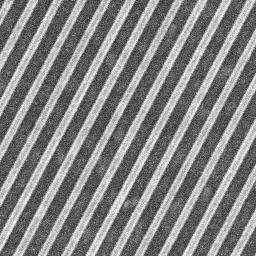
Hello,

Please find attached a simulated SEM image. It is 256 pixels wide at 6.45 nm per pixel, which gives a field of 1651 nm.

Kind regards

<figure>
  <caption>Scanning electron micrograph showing parallel lines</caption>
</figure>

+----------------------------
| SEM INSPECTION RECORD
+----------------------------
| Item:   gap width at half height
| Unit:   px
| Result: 14.9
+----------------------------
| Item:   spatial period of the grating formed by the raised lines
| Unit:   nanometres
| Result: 137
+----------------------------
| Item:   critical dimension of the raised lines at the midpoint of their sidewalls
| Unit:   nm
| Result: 39.8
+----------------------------